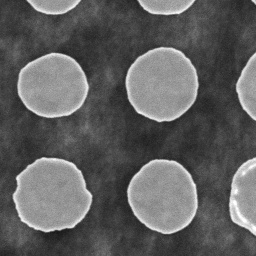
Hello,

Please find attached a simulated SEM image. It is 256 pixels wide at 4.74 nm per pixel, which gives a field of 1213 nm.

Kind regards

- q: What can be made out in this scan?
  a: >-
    raised bodies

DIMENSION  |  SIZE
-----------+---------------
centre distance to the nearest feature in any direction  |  518 nanometres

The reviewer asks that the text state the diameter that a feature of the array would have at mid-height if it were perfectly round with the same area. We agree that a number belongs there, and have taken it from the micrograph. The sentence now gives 339 nm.